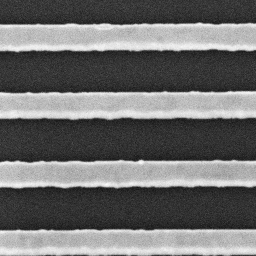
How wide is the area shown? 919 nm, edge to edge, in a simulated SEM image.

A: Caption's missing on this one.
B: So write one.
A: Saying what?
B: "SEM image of lines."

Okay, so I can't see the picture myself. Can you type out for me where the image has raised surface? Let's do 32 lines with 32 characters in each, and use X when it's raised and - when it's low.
--------------------------------
--------------------------------
--------------------------------
XXXXXXXXXXXXXXXXXXXXXXXXXXXXXXXX
XXXXXXXXXXXXXXXXXXXXXXXXXXXXXXXX
XXXXXXXXXXXXXXXXXXXXXXXXXXXXXXXX
--------------------------------
--------------------------------
--------------------------------
--------------------------------
--------------------------------
--------------------------------
XXXXXXXXXXXXXXXXXXXXXXXXXXXXXXXX
XXXXXXXXXXXXXXXXXXXXXXXXXXXXXXXX
XXXXXXXXXXXXXXXXXXXXXXXXXXXXXXXX
--------------------------------
--------------------------------
--------------------------------
--------------------------------
--------------------------------
XXXXXXXXXXXXXXXXXXXXXXXXXXXXXXXX
XXXXXXXXXXXXXXXXXXXXXXXXXXXXXXXX
XXXXXXXXXXXXXXXXXXXXXXXXXXXXXXXX
--------------------------------
--------------------------------
--------------------------------
--------------------------------
--------------------------------
--------------------------------
XXXXXXXXXXXXXXXXXXXXXXXXXXXXXXXX
XXXXXXXXXXXXXXXXXXXXXXXXXXXXXXXX
XXXXXXXXXXXXXXXXXXXXXXXXXXXXXXXX